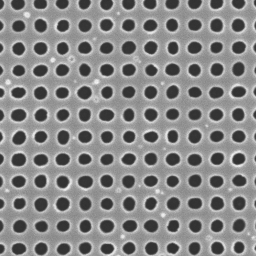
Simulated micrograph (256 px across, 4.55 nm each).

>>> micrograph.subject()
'a regular array of holes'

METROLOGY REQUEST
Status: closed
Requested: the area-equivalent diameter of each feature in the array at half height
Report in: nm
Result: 58.4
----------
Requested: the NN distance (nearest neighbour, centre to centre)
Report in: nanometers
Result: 98.5